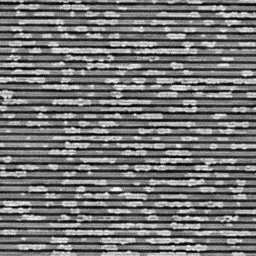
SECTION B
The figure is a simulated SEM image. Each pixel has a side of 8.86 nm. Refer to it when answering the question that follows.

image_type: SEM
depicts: parallel lines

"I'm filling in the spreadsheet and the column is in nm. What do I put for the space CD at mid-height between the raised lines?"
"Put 34.3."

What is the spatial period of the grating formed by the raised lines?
64.5 nm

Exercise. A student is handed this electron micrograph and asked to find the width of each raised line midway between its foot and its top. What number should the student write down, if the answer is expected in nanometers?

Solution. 34.3